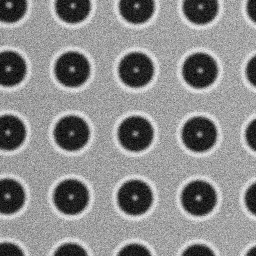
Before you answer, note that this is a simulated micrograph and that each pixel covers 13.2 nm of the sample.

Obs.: an array of small figures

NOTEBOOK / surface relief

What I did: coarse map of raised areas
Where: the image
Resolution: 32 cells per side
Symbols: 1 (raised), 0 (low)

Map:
00001110000011100001111000011110
00011110000111100001111000011110
00011110000111100001111000011110
11111111111111111111111111111111
11111111111111111111111111111111
11111111111111111111111111111111
00111111001111110011111100111111
00011110000111100001111000011110
00011110000111100001111000011110
00011110000111100001111000011110
00011110000111100001111000011110
11111111111111111111111111111111
11111111111111111111111111111111
11111111111111111111111111111111
00111111001111110011111100111111
00011110000111100001111000011110
00011110000111100001110000011100
00011110000111100001111000011110
00111110000111100001111000011110
11111111111111111111111111111111
11111111111111111111111111111111
11111111111111111111111111111111
00111111001111110011111100111111
00011110000111100001111000011110
00011100000111000001110000011100
00011110000111100001111000011100
00111110001111100001111000011110
11111111111111111111111111111111
11111111111111111111111111111111
11111111111111111111111111111111
00111111001111110011111100111111
00011110000111100001111000011110